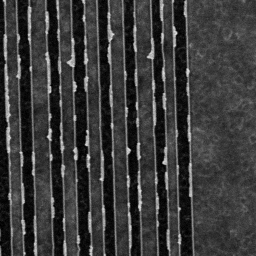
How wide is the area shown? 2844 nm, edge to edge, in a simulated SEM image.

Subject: parallel lines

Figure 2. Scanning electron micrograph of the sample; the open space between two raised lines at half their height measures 0.135 microns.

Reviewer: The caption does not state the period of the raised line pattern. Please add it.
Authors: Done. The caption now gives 26 pixels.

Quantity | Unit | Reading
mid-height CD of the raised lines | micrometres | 0.143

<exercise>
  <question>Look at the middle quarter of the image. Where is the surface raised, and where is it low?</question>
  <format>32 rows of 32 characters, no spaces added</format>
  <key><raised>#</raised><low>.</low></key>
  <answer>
..####...###...###....###...###.
..####...###...###....###...###.
..####...###...###....###...###.
..####...###...###....###...###.
..####...###...###....###...###.
..####...###...###....###...###.
..####...###...###....###...###.
..####...###...###....###...###.
..####...###...###....###...###.
..####...###...###....###...###.
..####...###....##....###...###.
..####...###....##....###...###.
...###...###....##....###...###.
...###...###....###...###...###.
...###...###....###...###...###.
...###...###....###...###...###.
...###...###....##.....##...###.
...###...###....##.....###..####
...###...###....###....###..####
...###...###....###....###..####
...###...###....###....###..###.
...###...###....###....###..###.
...###...###....###....###..####
...###...###....###....###..####
...###...###....###....###..####
...###...###....###....###..####
...###...###....###....###..####
...###...###....###....###..####
...###...###....###....###..####
...###...###....###....###..####
...###....##....###....###...###
...###....##....###....###...###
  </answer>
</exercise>